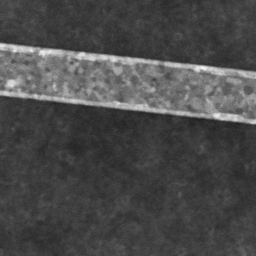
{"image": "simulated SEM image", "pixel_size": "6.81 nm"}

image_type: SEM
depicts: one or a few lines or trenches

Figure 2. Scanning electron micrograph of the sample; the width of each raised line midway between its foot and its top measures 322 nm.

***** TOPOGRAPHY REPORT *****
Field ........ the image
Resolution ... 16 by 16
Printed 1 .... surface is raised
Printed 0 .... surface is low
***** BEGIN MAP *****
0000000000000000
0000000000000000
0000000000000000
1111110000000000
1111111111111110
1111111111111111
0000001111111111
0000000000000001
0000000000000000
0000000000000000
0000000000000000
0000000000000000
0000000000000000
0000000000000000
0000000000000000
0000000000000000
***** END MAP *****